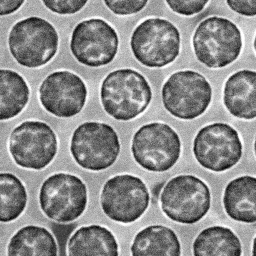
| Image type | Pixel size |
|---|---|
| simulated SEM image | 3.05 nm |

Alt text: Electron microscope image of a regular array of holes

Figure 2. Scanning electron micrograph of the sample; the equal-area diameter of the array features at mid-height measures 150 nm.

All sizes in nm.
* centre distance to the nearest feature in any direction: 183